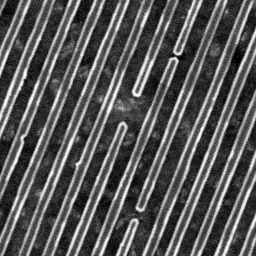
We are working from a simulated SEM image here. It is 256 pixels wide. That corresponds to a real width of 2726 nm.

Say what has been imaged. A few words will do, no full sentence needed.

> parallel lines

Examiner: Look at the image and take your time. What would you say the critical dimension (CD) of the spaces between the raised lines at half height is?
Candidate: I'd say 155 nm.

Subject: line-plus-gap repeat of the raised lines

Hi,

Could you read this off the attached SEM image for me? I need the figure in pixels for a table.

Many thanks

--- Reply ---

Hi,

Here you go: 22.9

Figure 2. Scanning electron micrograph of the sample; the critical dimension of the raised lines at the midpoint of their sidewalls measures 92.8 nanometers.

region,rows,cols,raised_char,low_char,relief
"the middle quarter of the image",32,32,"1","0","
01100001110000110000110000110000
01100001100001100001100001110000
01100001100001100001100001100001
11000011000011000001100001100001
11000011000011000011000011000011
11000111000011000011000011000011
10000110000110000110000111000111
10000110000110000110000110000111
00001100001110000000000110000110
00001100001100000000001100001110
00011100001100000000001100001100
00011000011000000000011100001100
00111000011000000000011000011100
00110000111000000000011000011000
00110000110000000000111000111000
01110000110000100000110000110000
01100001100001100001110000110000
01100001100001100001100001110000
11000011100001100001100001100001
11000011000011000011100001100001
11000011000011000011000011000001
10000111000110000011000011000011
10000110000110000110000111000011
00001110001110000110000110000111
00001100001100000110001110000111
00011100001100001100001100000110
00011100011100001100001100001110
00011000011000011000011000001110
00111000111000011000011000011100
00110000111000111000011000011100
00110000110000110000110000011000
01110001110001110000110000111000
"